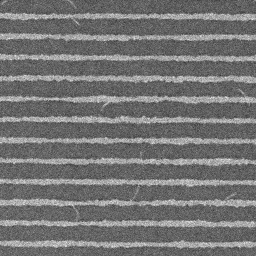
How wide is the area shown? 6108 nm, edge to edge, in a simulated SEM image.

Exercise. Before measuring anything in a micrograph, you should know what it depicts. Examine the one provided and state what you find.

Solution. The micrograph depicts parallel lines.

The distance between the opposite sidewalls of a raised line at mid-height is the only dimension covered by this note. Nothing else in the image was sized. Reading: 101 nanometers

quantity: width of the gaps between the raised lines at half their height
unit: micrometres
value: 0.394